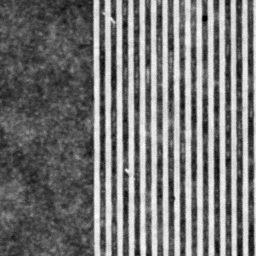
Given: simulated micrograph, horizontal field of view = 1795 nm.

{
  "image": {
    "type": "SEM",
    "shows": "parallel lines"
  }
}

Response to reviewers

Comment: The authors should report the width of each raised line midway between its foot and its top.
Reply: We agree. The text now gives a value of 0.0272 µm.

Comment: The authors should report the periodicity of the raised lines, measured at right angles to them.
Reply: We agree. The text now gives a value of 80 nm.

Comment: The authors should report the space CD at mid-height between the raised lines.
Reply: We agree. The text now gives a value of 54.3 nanometres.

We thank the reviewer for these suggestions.